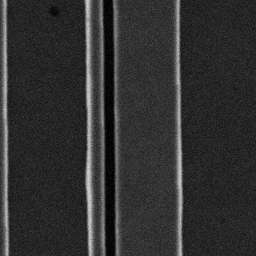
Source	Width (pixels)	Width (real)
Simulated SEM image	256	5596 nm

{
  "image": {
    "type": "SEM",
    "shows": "lines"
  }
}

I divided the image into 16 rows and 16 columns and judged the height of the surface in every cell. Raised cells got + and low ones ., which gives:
.......++++.....
.....+.++++.....
.......++++.....
.......++++.....
.......++++.....
.......++++.....
.......++++.....
.......++++.....
......+++++.....
......+++++.....
......+++++.....
......+++++.....
......+++++.....
......+++++.....
......+++++.....
......+++++.....